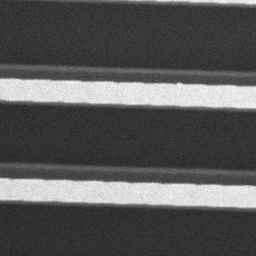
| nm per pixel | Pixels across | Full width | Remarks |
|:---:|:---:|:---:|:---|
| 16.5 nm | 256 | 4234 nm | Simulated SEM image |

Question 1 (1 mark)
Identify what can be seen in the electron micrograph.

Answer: lines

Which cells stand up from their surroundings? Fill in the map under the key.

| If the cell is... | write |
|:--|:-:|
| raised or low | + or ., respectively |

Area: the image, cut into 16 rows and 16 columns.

................
................
................
................
++++++++........
++++++++++++++++
.........+++++++
................
................
................
+++.............
++++++++++++++++
.+++++++++++++++
................
................
................